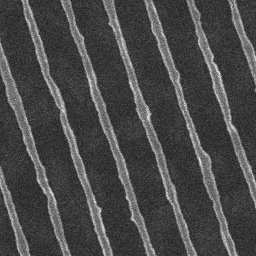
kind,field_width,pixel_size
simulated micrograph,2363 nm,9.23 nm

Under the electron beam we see parallel lines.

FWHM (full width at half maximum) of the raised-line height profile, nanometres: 71.2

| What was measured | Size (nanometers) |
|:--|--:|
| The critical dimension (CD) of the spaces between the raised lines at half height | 291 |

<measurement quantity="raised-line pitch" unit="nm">363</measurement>